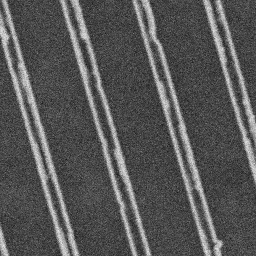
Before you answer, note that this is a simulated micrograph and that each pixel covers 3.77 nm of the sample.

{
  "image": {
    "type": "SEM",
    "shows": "one or a few lines or trenches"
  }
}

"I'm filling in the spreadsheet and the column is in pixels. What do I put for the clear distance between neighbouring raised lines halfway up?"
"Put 54.5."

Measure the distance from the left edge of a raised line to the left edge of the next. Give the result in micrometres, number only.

0.259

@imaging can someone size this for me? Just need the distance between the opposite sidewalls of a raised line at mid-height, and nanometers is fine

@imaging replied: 51.7